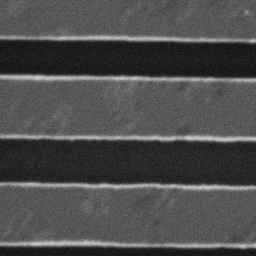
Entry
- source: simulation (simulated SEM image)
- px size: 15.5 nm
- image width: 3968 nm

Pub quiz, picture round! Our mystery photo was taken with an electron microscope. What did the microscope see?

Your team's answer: lines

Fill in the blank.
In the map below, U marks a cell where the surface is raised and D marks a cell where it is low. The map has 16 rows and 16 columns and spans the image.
UUUUUUUUUUUUUUUU
UUUUUUUUUUUUUUUU
DDDDDDDDUUUUUUUU
DDDDDDDDDDDDDDDD
DDDDDDDDDDDDDDDD
UUUUUUUUUUUUUUUU
UUUUUUUUUUUUUUUU
UUUUUUUUUUUUUUUU
UUUUUUUUUUUUUUUU
DDDDDDDDDDDDDDDD
DDDDDDDDDDDDDDDD
UUUDDDDDDDDDDDDD
UUUUUUUUUUUUUUUU
UUUUUUUUUUUUUUUU
UUUUUUUUUUUUUUUU
DDDDDDDDDDDDDDDD